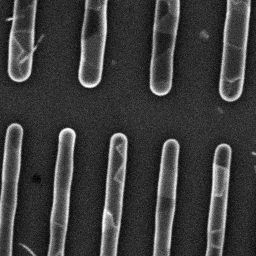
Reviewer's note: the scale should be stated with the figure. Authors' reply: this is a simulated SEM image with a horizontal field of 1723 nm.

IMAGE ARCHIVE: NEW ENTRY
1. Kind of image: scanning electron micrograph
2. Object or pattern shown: groups of lines, slits or small figures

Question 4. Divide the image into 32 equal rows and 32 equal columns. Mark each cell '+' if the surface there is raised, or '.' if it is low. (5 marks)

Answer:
..++.......++.......++.......++.
..++.......++......+++......+++.
..++.......++......+++......+++.
..++......+++......+++......+++.
.+++......+++......+++......+++.
.+++......+++......+++......+++.
.+++......+++......+++......+++.
.+++......+++......++.......+++.
.+++......+++......++.......++..
.++.......+++......++.......++..
..........++.......++.......++..
...................++.......++..
................................
................................
................................
................................
.++.....+.......................
.++....++.....++................
.++....++.....++....++.....++...
.+.....++.....++....++.....++...
.+.....++.....++....++.....++...
++.....++.....++....++.....++...
++.....++....++.....++.....++...
++.....++....++.....++.....+....
++.....++....++.....++....++....
++.....++....++.....++....++....
++.....+.....++.....++....++....
++....++.....++.....++....++....
+.....++.....++.....+.....++....
+.....++.....++....++.....++....
+.....++.....++....++.....++....
+.....++.....+.....++.....++....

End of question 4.